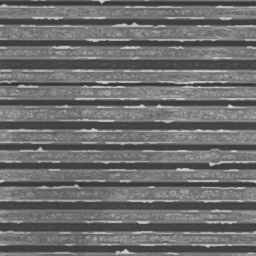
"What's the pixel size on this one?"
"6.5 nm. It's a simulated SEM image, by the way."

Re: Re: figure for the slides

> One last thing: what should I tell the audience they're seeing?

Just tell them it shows parallel lines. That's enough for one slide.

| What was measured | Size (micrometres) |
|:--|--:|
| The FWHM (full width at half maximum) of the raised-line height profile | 0.0846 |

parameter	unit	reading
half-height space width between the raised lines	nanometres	45.5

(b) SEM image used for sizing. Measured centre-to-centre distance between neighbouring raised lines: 134 nanometres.